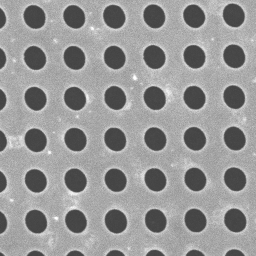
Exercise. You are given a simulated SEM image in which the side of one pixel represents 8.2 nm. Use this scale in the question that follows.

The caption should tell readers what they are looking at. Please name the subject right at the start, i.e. a regular array of holes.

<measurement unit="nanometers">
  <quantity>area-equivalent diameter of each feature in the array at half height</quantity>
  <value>187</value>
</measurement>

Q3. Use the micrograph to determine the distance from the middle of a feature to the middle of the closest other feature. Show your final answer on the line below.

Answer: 325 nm